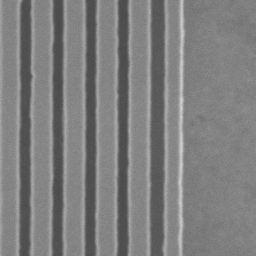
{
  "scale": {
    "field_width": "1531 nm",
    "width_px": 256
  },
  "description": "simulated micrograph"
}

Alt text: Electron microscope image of parallel lines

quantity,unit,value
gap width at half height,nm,63.5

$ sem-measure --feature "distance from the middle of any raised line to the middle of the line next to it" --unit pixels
32.9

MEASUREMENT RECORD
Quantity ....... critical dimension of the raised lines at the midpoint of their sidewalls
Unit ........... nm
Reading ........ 127